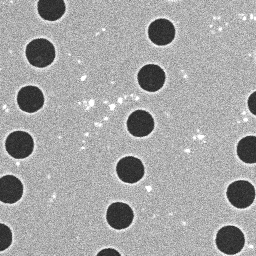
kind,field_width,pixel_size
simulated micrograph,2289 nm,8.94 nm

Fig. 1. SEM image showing a regular array of holes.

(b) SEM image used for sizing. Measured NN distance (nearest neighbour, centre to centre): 0.421 µm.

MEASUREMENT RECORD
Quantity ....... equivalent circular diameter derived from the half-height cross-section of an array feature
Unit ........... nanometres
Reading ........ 254